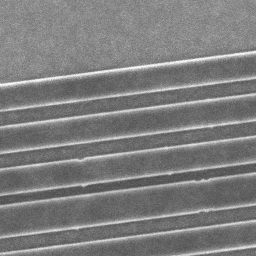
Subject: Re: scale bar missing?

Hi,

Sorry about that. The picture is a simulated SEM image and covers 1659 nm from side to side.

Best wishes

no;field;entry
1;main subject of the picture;parallel lines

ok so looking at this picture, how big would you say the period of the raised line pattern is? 41.2 pixels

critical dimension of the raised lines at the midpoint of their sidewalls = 0.175 micrometres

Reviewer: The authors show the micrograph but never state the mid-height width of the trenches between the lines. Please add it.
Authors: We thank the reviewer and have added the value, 96.5 nm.